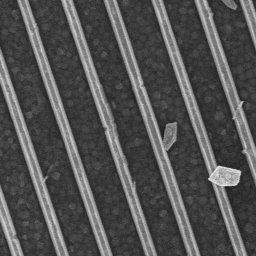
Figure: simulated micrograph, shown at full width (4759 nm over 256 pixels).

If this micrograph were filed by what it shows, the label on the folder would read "parallel lines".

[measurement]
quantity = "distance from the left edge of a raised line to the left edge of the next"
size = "787 nanometres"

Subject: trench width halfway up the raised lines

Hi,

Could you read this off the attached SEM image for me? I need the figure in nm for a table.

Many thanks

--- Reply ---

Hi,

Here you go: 635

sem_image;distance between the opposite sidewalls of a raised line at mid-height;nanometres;141